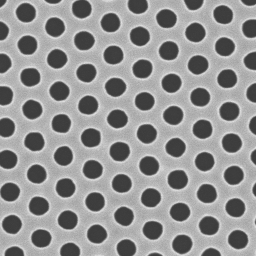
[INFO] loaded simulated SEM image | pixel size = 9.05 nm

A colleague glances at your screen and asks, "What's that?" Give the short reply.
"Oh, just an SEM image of a regular array of holes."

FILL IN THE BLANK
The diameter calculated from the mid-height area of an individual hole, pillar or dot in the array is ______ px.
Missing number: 19.6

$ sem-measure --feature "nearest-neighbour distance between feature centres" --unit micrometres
0.29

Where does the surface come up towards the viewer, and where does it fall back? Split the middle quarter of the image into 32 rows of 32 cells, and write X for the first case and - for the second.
XXXX---XXXXXXXXXX-----XXXXXXXXX-
XXX-----XXXXXXXXX-----XXXXXXXXX-
XXX-----XXXXXXXXX-----XXXXXXXXXX
XXXX----XXXX--XXXXX-XXXXX----XXX
XXXXX--XXXX----XXXXXXXXX-----XXX
-XXXXXXXXX------XXXXXXXX-----XXX
-XXXXXXXXX-----XXXXXXXXXX----XXX
-XXXXXXXXXX----XXXX---XXXXXXXXXX
-XXXX---XXXXXXXXXX----XXXXXXXXXX
XXXX----XXXXXXXXXX-----XXXXXXXXX
XXXX-----XXXXXXXXX----XXXXX-XXXX
XXXX----XXXX--XXXXX--XXXX-----XX
XXXXX--XXXX----XXXXXXXXXX-----XX
-XXXXXXXXXX-----XXXXXXXXX-----XX
--XXXXXXXXX-----XXXXXXXXXX---XXX
--XXXXXXXXXX---XXXX---XXXXXXXXXX
-XXXX---XXXXXXXXXX-----XXXXXXXXX
XXXX-----XXXXXXXXX-----XXXXXXXXX
XXXX-----XXXXXXXXX-----XXXX--XXX
XXXX-----XXXX--XXXX---XXXX----XX
XXXXX---XXXX----XXXXXXXXX-----XX
--XXXXXXXXX-----XXXXXXXXX-----XX
--XXXXXXXXX-----XXXXXXXXXX----XX
--XXXXXXXXXX----XXXX---XXXXXXXXX
--XXXX---XXXXXXXXXX-----XXXXXXXX
XXXXX-----XXXXXXXXX-----XXXXXXXX
XXXXX-----XXXXXXXXX-----XXXXXXXX
XXXXX----XXXXX-XXXXX---XXX----XX
-XXXXX--XXXX----XXXXXXXXXX-----X
--XXXXXXXXXX-----XXXXXXXXX-----X
---XXXXXXXXX-----XXXXXXXXX----XX
---XXXXXXXXXX---XXXX---XXXXXXXXX